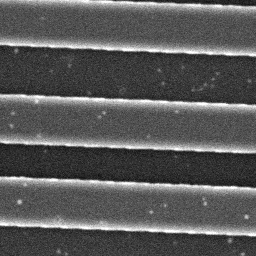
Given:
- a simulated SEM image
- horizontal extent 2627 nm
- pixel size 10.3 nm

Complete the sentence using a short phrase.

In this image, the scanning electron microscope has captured lines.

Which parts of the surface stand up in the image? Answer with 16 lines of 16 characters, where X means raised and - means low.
XXXXXXXXXXXXXXXX
XXXXXXXXXXXXXXXX
XXXXXXXXXXXXXXXX
----------------
----------------
----------------
XXXXXXXXXXXXX---
XXXXXXXXXXXXXXXX
XXXXXXXXXXXXXXXX
--------------XX
----------------
XXXXXXXXXX------
XXXXXXXXXXXXXXXX
XXXXXXXXXXXXXXXX
-----------XXXXX
----------------